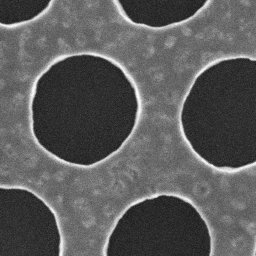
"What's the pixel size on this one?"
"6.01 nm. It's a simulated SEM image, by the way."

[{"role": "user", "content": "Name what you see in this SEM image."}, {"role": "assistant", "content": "holes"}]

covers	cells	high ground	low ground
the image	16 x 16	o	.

...oooo......ooo
ooooooooo..ooooo
oooooooooooooooo
ooooo.oooooooooo
ooo.....ooooo...
oo......oooo....
oo.......ooo....
oo.......oo.....
oo......oooo....
ooo....ooooo....
oooooooooooooo.o
oooooooooooooooo
...oooooo...oooo
...ooooo.....ooo
....ooo......ooo
....ooo......ooo